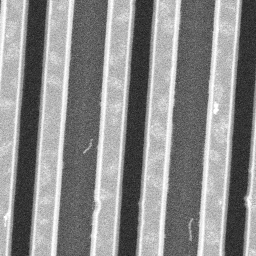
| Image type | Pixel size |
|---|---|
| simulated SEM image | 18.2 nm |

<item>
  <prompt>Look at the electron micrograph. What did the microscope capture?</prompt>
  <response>parallel lines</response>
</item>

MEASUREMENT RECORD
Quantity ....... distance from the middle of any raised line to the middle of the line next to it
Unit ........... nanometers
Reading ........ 1010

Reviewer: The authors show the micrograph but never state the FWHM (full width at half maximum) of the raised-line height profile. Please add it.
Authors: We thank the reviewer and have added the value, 0.416 microns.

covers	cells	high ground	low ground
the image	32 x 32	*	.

***...***.....***...**.....***..
***...***.....***..***.....***..
***...***.....**...***.....***..
***...***.....**...***.....***..
***...***....***...***.....***..
***...***....***...***.....***..
***...**.....***...***.....**...
***...**.....***...***.....**...
***...**.....***...***.....**...
***...**.....***...***.....**...
***..***.....***...***....***...
**...***.....***...**.....***...
**...***.....***...**.....***...
**...***.....***...**.....***...
**...***.....***...**.....***...
**...***.....***..***.....***...
**...***.....**...***.....***...
**...***.....**...***.....***...
**...***.....**...***.....***...
**...***....***...***.....***...
**...***....***...***.....***..*
**...**.....***...***.....**...*
**...**.....***...***.....**...*
**...**.....***...***.....**...*
**..***.....***...**.....***...*
*...***.....***...**.....***...*
*...***.....***...**.....***...*
*...***.....***...**.....***...*
*...***.....***...**.....***...*
*...***.....***..***.....***...*
*...***.....**...***.....***...*
*...***.....**...***.....***...*